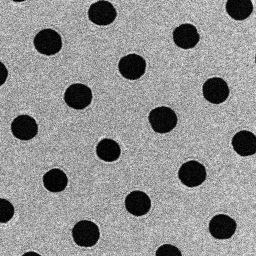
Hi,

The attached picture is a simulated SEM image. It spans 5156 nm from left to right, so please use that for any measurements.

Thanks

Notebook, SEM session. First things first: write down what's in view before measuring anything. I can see a regular array of holes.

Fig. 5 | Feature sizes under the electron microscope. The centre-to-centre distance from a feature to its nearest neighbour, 1230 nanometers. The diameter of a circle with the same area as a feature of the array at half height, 539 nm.